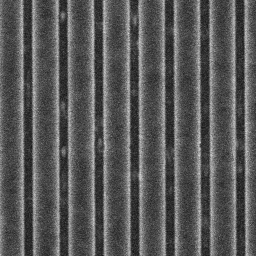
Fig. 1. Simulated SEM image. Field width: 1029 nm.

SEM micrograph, parallel lines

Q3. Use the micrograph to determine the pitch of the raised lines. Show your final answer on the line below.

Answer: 142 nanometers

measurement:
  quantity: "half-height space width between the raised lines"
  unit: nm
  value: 38.7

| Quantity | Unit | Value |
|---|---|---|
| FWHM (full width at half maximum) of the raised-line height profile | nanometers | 104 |